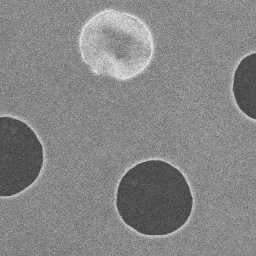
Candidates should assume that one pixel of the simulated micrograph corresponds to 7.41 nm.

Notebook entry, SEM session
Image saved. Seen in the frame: holes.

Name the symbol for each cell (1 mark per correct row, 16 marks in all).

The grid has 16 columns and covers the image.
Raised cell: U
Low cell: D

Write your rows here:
UUUUUUUUUUUUUUUU
UUUUUUUUUUUUUUUU
UUUUUUUUUUUUUUUU
UUUUUUUUUUUUUUUU
UUUUUUUUUUUUUUUD
UUUUUUUUUUUUUUUD
UUUUUUUUUUUUUUUD
DUUUUUUUUUUUUUUU
DDUUUUUUUUUUUUUU
DDDUUUUUUUUUUUUU
DDDUUUUUDDDUUUUU
DDUUUUUDDDDDUUUU
UUUUUUUDDDDDUUUU
UUUUUUUUDDDDUUUU
UUUUUUUUUDDUUUUU
UUUUUUUUUUUUUUUU